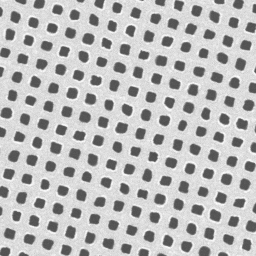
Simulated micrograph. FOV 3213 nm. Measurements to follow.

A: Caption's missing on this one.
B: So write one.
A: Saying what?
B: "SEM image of a regular array of holes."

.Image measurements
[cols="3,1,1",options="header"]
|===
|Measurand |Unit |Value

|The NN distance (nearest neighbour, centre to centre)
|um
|0.233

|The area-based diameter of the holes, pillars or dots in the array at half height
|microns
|0.139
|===